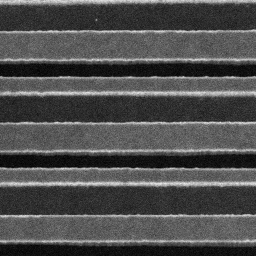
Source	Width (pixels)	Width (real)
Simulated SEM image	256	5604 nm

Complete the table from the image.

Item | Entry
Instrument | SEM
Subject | lines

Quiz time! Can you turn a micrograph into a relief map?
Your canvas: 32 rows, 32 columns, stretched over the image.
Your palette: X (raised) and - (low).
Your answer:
--------------------------------
--------------------------------
--------------------------------
--------------------------------
XXXXXXXXXXXXXXXXXXXXXXXXXXXXXXXX
XXXXXXXXXXXXXXXXXXXXXXXXXXXXXXXX
XXXXXXXXXXXXXXXXXXXXXXXXXXXXXXXX
XXXXXXXXXXXXXXXXXXXXXXXXXXXXXXXX
--------------------------------
--------------------------------
XXXXXXXXXXXXXXXXXXXXXXXXXXXXXXXX
XXXXXXXXXXXXXXXXXXXXXXXXXXXXXXXX
--------------------------------
--------------------------------
--------------------------------
XXXXXXXXXXXXXXXXXXXXXXXXXXXXXXXX
XXXXXXXXXXXXXXXXXXXXXXXXXXXXXXXX
XXXXXXXXXXXXXXXXXXXXXXXXXXXXXXXX
XXXXXXXXXXXXXXXXXXXXXXXXXXXXXXXX
--------------------------------
--------------------------------
XXXXXXXXXXXXXXXXXXXXXXXXXXXXXXXX
XXXXXXXXXXXXXXXXXXXXXXXXXXXXXXXX
--------------------------------
--------------------------------
--------------------------------
--------------------------------
XXXXXXXXXXXXXXXXXXXXXXXXXXXXXXXX
XXXXXXXXXXXXXXXXXXXXXXXXXXXXXXXX
XXXXXXXXXXXXXXXXXXXXXXXXXXXXXXXX
--------------------------------
--------------------------------